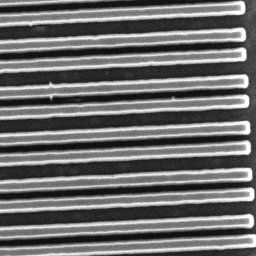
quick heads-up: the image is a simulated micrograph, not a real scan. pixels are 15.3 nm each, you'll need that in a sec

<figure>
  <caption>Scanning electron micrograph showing parallel lines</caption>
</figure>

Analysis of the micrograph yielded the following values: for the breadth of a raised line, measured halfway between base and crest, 163 nanometers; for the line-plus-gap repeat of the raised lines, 359 nm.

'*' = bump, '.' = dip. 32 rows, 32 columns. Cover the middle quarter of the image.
**********......................
................................
................................
................................
.................***************
********************************
*************************..***..
*****.**........................
................................
..................**************
********************************
************************........
******..........................
................................
................................
...............................*
..........**********************
********************************
*********************...........
*...............................
.............................***
..........**********************
********************************
******************..............
................................
................................
................................
...................**.*.********
...*****************************
********************************
************....................
................................